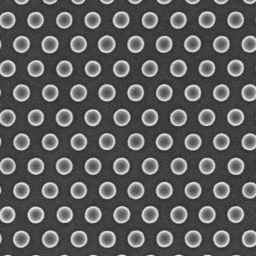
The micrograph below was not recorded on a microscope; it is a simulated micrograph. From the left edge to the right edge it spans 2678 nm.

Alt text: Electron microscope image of a regular array of raised bodies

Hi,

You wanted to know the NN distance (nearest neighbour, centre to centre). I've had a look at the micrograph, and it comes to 292 nanometres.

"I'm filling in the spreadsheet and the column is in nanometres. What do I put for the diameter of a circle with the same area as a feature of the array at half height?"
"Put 162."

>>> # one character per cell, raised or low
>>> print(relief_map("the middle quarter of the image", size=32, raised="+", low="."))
++...++++....+++....+++....+++..
++...++++....+++....+++....+++..
+.....++.....+++....+++....+++..
................................
................................
...+......++.....++.....++......
..+++....++++...++++...++++...++
..+++....++++...++++...++++...++
..+++....+++.....++.....++.....+
................................
................................
+.............+.................
++....+++....+++....+++....+++..
++...++++....+++....+++....+++..
++....+++....+++....+++....+++..
................................
................................
................................
..+++....++++...++++...++++....+
..++++...++++...++++...++++...++
..+++....+++....++++...++++...++
................................
................................
................................
++....+++....+++....+++....+++..
++....+++....+++....+++....+++..
++....+++....+++....+++....+++..
................................
................................
................................
..+++....+++.....++.....+++....+
..++++...++++...++++...++++...++